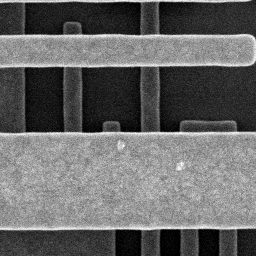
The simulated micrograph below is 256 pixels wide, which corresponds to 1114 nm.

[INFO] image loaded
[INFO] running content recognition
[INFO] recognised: wiring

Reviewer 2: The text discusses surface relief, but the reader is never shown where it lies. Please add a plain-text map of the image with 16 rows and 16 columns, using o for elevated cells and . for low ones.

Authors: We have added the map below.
................
................
oooooooooooooooo
oooooooooooooooo
................
................
................
................
oooooooooooooooo
oooooooooooooooo
oooooooooooooooo
oooooooooooooooo
oooooooooooooooo
oooooooooooooooo
................
................